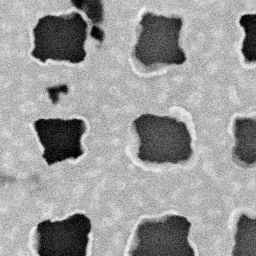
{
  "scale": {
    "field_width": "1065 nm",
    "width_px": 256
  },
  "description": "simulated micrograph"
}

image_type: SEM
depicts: holes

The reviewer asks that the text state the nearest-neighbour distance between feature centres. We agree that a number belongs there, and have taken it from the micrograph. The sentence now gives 0.408 µm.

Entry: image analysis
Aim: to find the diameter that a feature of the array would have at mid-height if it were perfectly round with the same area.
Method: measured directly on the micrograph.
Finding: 230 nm